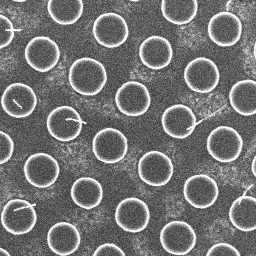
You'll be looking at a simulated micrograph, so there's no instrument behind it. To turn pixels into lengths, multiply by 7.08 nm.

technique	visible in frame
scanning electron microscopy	a regular array of raised bodies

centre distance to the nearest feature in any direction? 358 nanometres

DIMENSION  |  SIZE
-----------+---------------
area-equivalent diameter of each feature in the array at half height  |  235 nanometres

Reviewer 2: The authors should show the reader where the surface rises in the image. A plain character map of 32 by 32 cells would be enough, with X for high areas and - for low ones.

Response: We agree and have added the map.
------XXXX----------XXXXX-------
------XXXX----------XXXX--------
X------XX---XXX------XXX--XXXX--
XX----------XXXX----------XXXX--
XX----------XXXX----------XXXX--
X---XXX------XX---XXX------XX---
---XXXX-----------XXX-----------
---XXXX---XX------XXX---XX------
----XX---XXXX------X---XXXX-----
---------XXXX----------XXXX-----
---------XXXX---X-------XXX---XX
-XXX------XX---XXX-----------XXX
XXXX-----------XXXX----------XXX
-XXX---XX------XXX---XX------XXX
--X---XXXX----------XXXX--------
------XXXX----------XXXX--------
------XXXX---XX------XXX---XX---
X-------X---XXXX----------XXXX--
XX----------XXXX----------XXXX--
X---XX------XXX---XXX------XXX--
---XXXX----------XXXX-----------
---XXXX----------XXXX-----------
----XXX---XX------XXX---XX------
---------XXXX----------XXXX-----
---------XXXX----------XXXX-----
-XXX------XX---XXX------XX---XXX
XXXX-----------XXX-----------XXX
XXXX-----------XXX-----------XXX
-XXX---XX------XXX---XXX------XX
------XXXX----------XXXX--------
------XXXX----------XXXX--------
X------XX---XXX------XX---XXXX--